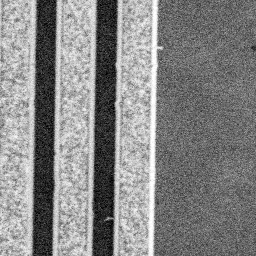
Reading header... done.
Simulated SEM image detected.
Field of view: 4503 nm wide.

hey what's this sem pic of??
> parallel lines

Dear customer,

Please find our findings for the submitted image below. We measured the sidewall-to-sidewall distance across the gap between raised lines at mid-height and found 436 nm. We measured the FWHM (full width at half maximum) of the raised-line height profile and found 0.633 micrometres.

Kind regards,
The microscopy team